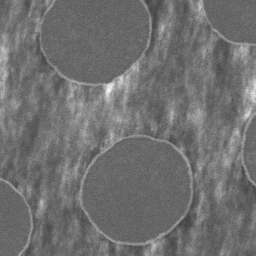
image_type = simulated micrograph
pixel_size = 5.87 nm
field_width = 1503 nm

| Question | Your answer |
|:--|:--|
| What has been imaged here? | raised bodies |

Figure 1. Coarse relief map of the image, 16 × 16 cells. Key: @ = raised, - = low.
---@@@@@@----@@@
---@@@@@@----@@@
---@@@@@@-----@@
---@@@@@@-------
----@@@@--------
----------------
----------------
----------------
--------@------@
------@@@@@----@
------@@@@@@---@
@----@@@@@@@----
@@---@@@@@@@----
@@---@@@@@@-----
@@----@@@@------
@@--------------